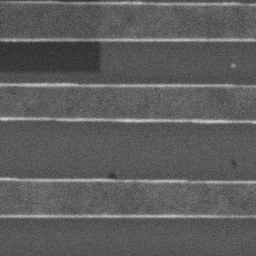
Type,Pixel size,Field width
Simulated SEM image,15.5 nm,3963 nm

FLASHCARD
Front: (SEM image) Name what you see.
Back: lines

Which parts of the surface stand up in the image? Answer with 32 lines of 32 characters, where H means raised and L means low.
HHHHHHHHHHHHHHHHHHHHHHHHHHHHHLLL
HHHHHHHHHHHHHHHHHHHHHHHHHHHHHHHH
HHHHHHHHHHHHHHHHHHHHHHHHHHHHHHHH
HHHHHHHHHHHHHHHHHHHHHHHHHHHHHHHH
HHHHHHHHHHHHHHHHHHHHHHHHHHHHHHHH
LLLLLLLLLLLLLLLLLLLLLLLLLLLLLLLL
LLLLLLLLLLLLLLLLLLLLLLLLLLLLLLLL
LLLLLLLLLLLLLLLLLLLLLLLLLLLLLLLL
LLLLLLLLLLLLLLLLLLLLLLLLLLLLLLLL
LLLLLLLLLLLLLLLLLLLLLLLLLLLLLLLL
LLLLLLLLLLLLLLLLLLLLLLLLLLLLLLLL
HHHHHHHHHHHHHHHHHHHHHHHHHHHHHHHH
HHHHHHHHHHHHHHHHHHHHHHHHHHHHHHHH
HHHHHHHHHHHHHHHHHHHHHHHHHHHHHHHH
HHHHHHHHHHHHHHHHHHHHHHHHHHHHHHHH
LLLLLLLLLLLLLLLLLLLLLLLLLLLLLLLL
LLLLLLLLLLLLLLLLLLLLLLLLLLLLLLLL
LLLLLLLLLLLLLLLLLLLLLLLLLLLLLLLL
LLLLLLLLLLLLLLLLLLLLLLLLLLLLLLLL
LLLLLLLLLLLLLLLLLLLLLLLLLLLLLLLL
LLLLLLLLLLLLLLLLLLLLLLLLLLLLLLLL
LLLLLLLLLLLLLLLLLLLLLLLLLLLLLLLL
HLLLLLLLLLLLLLLLLLLLLLLLLLLLLLLL
HHHHHHHHHHHHHHHHHHHHHHHHHHHHHHHH
HHHHHHHHHHHHHHHHHHHHHHHHHHHHHHHH
HHHHHHHHHHHHHHHHHHHHHHHHHHHHHHHH
HHHHHHHHHHHHHHHHHHHHHHHHHHHHHHHH
LLLLLLLLLLLLLLLLLLLLLLLLLLLLLLLL
LLLLLLLLLLLLLLLLLLLLLLLLLLLLLLLL
LLLLLLLLLLLLLLLLLLLLLLLLLLLLLLLL
LLLLLLLLLLLLLLLLLLLLLLLLLLLLLLLL
LLLLLLLLLLLLLLLLLLLLLLLLLLLLLLLL